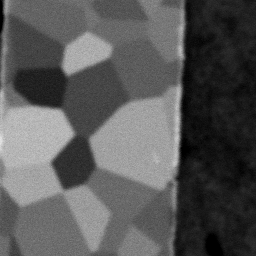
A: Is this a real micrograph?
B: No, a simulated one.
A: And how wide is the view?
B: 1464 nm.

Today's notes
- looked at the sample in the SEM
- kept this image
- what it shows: one or a few lines or trenches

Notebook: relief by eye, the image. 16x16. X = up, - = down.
XXXXXXXXXXX-----
XXXXXXXXXXX-----
XXXXXXXXXXX-----
XXXXXXXXXXX-----
XXXXXXXXXXX-----
XXXXXXXXXXX-----
XXXXXXXXXXX-----
XXXXXXXXXXX-----
XXXXXXXXXXX-----
XXXXXXXXXXX-----
XXXXXXXXXXX-----
XXXXXXXXXXX-----
XXXXXXXXXXX-----
XXXXXXXXXXX-----
XXXXXXXXXXX-----
XXXXXXXXXXX-----